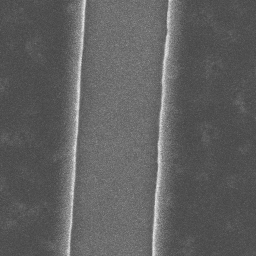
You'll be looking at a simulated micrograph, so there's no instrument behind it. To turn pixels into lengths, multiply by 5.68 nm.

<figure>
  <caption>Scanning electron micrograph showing one or a few lines or trenches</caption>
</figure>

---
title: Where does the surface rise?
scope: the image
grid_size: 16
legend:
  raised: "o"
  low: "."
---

ooooo......ooooo
ooooo.....oooooo
ooooo.....oooooo
ooooo.....oooooo
ooooo.....oooooo
ooooo.....oooooo
ooooo.....oooooo
ooooo.....oooooo
ooooo.....oooooo
ooooo.....oooooo
ooooo.....oooooo
ooooo.....oooooo
ooooo.....oooooo
oooo......oooooo
oooo......oooooo
oooo......oooooo